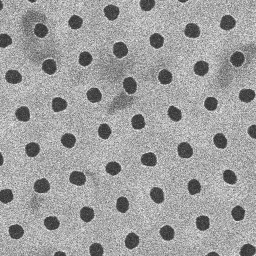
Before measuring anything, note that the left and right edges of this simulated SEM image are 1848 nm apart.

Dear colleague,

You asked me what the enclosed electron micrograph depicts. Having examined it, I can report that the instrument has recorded a regular array of holes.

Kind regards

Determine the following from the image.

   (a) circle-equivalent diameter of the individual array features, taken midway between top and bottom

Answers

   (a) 0.108 um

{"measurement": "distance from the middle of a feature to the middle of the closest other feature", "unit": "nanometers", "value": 264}